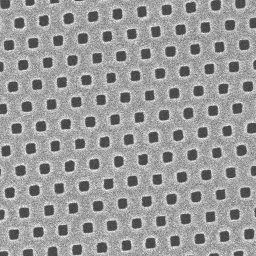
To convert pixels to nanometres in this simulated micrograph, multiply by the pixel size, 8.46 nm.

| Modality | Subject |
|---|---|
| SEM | a regular array of holes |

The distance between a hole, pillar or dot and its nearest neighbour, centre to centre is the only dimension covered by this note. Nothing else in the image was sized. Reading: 204 nm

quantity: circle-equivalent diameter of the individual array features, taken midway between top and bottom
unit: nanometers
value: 95.4